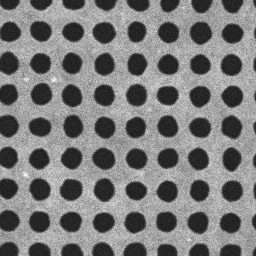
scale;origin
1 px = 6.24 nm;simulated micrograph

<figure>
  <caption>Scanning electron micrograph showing a regular array of holes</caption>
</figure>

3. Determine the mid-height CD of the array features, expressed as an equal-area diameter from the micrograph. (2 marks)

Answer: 130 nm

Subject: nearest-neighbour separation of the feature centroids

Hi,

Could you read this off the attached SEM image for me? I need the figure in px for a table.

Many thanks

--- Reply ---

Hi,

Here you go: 31.1